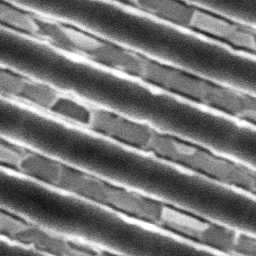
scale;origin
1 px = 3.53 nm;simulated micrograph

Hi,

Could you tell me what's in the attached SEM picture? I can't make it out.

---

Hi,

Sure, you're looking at one or a few lines or trenches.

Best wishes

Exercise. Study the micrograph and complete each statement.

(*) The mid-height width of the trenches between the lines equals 89.9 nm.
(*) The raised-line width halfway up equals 140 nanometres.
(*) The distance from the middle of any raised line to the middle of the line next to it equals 231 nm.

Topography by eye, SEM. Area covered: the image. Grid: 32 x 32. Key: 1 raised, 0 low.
00111111111111100000000011111111
00001111111111111100000000011111
00000001111111111111000000000111
10000000001111111111111000000000
11110000000011111111111110000000
11111100000000011111111111110000
11111111100000000111111111111110
11111111111000000000111111111111
01111111111111000000001111111111
00011111111111110000000001111111
00000111111111111110000000001111
00000000111111111111100000000011
11000000001111111111111100000000
11110000000001111111111111000000
11111100000000011111111111111000
11111111100000000011111111111110
11111111111100000000111111111111
01111111111111000000000111111111
00011111111111111000000000111111
00000011111111111110000000001111
00000000111111111111110000000011
11000000000111111111111100000000
11111000000001111111111111100000
11111110000000001111111111111100
11111111110000000011111111111111
11111111111100000000011111111111
01111111111111100000000011111111
00011111111111111000000100111111
00000111111111111111000000000111
00000000111111111111111000000001
11100000000111111111111110000000
11111000000000111111111111110000